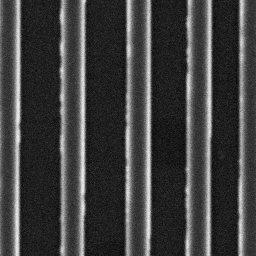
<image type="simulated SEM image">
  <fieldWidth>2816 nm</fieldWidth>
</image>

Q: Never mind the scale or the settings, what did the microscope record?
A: lines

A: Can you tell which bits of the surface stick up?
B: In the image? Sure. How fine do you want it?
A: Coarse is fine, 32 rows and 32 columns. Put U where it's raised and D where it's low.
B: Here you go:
UUDDDDDDUUDDDDDDUUUDDDDDUUDDDDUU
UUDDDDDDUUDDDDDDUUUDDDDDUUDDDDUU
UUDDDDDDUUDDDDDDUUUDDDDDUUDDDDUU
UUDDDDDDUUDDDDDDUUUDDDDDUUDDDDUU
UUDDDDDDUUDDDDDDUUUDDDDDUUDDDDUU
UUDDDDDDUUDDDDDDUUUDDDDDUUDDDDUU
UUDDDDDDUUDDDDDDUUUDDDDDUUDDDDUU
UUDDDDDDUUDDDDDDUUUDDDDDUUDDDDUU
UUDDDDDDUUDDDDDDUUUDDDDDUUDDDDUU
UUDDDDDDUUDDDDDDUUUDDDDDUUDDDDUU
UUDDDDDDUUDDDDDDUUUDDDDUUUDDDDUU
UUDDDDDDUUDDDDDDUUUDDDDUUUDDDDUU
UUDDDDDDUUDDDDDDUUUDDDDUUUDDDDUU
UUDDDDDDUUDDDDDDUUUDDDDUUUDDDDUU
UUDDDDDDUUDDDDDDUUUDDDDUUUDDDDUU
UUDDDDDDUUDDDDDDUUUDDDDUUUDDDDUU
UUDDDDDDUUDDDDDDUUUDDDDUUUDDDDUU
UUDDDDDDUUDDDDDDUUUDDDDUUUDDDDUU
UUDDDDDDUUDDDDDDUUUDDDDUUUDDDDUU
UUDDDDDDUUDDDDDDUUUDDDDUUUDDDDUU
UUDDDDDDUUDDDDDDUUUDDDDUUUDDDDUU
UUDDDDDDUUDDDDDDUUUDDDDUUUDDDDUU
UUDDDDDDUUDDDDDDUUUDDDDUUUDDDDUU
UUDDDDDDUUDDDDDDUUUDDDDUUUDDDDUU
UUDDDDDDUUDDDDDDUUUDDDDUUUDDDDUU
UUDDDDDDUUDDDDDDUUUDDDDUUUDDDDUU
UUDDDDDDUUDDDDDDUUUDDDDUUUDDDDUU
UUDDDDDDUUDDDDDDUUUDDDDUUUDDDDUU
UUDDDDDDUUDDDDDDUUUDDDDUUUDDDDUU
UUDDDDDDUUDDDDDDUUUDDDDUUUDDDDUU
UUDDDDDDUUDDDDDDUUUDDDDUUUDDDDUU
UUDDDDDDUUDDDDDDUUUDDDDUUUDDDDUU